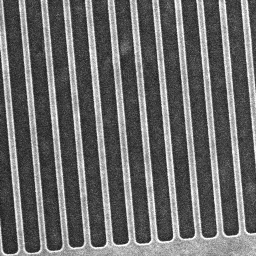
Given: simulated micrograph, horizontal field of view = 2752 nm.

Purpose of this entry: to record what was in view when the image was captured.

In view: parallel lines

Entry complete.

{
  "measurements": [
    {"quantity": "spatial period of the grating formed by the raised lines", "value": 238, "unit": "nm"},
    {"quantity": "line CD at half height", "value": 0.0629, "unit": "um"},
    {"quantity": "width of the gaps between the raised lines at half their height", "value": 182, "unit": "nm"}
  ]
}